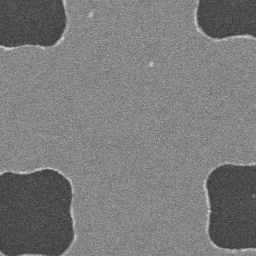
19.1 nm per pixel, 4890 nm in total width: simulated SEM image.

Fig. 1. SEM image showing holes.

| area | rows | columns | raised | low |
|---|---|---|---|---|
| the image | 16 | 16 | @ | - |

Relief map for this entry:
----@@@@@@@@----
----@@@@@@@@----
----@@@@@@@@@@@@
@@@@@@@@@@@@@@@@
@@@@@@@@@@@@@@@@
@@@@@@@@@@@@@@@@
@@@@@@@@@@@@@@@@
@@@@@@@@@@@@@@@@
@@@@@@@@@@@@@@@@
@@@@@@@@@@@@@@@@
@@@@@@@@@@@@@---
----@@@@@@@@@---
----@@@@@@@@@---
----@@@@@@@@@---
-----@@@@@@@@---
----@@@@@@@@@@--